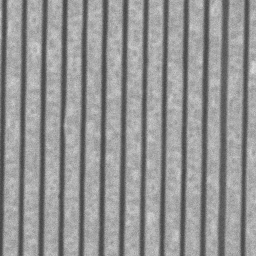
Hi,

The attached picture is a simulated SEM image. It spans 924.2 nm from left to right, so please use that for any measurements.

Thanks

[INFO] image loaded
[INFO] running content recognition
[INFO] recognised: parallel lines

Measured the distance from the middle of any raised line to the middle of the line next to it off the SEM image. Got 0.0729 microns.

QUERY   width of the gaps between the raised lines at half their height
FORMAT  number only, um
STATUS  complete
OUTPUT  0.0198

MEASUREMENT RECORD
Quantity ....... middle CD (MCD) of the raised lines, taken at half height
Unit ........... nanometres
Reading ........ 52.8